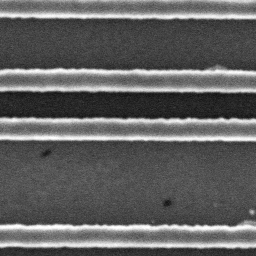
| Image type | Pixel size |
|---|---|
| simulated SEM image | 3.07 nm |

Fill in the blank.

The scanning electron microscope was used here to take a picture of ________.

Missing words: lines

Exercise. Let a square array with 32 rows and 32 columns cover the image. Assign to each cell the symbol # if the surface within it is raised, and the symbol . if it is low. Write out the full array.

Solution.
################################
################################
................................
................................
................................
................................
................................
................................
................................
################################
################################
...........................#####
................................
................................
................................
################################
################################
....................####.##.####
................................
................................
................................
................................
................................
................................
................................
................................
................................
................................
################################
################################
################################
................................